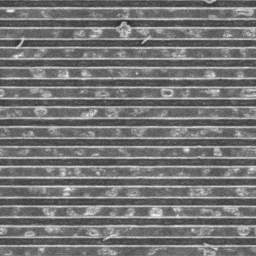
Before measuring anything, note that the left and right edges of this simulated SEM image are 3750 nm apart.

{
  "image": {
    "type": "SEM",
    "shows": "parallel lines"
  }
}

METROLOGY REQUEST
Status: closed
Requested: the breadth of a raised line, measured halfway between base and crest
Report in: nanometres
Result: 161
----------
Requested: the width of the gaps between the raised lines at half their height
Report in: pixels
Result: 8.5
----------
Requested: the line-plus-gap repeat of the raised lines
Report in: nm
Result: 290